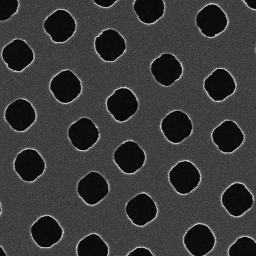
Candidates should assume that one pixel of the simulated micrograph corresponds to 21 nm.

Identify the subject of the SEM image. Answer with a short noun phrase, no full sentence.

a regular array of holes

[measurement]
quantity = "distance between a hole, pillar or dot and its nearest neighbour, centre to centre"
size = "1080 nanometers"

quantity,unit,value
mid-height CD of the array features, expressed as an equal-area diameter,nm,632